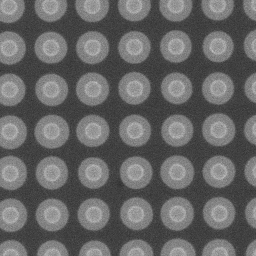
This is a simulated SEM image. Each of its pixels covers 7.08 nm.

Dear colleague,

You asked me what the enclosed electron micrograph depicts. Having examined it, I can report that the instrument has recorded an array of small figures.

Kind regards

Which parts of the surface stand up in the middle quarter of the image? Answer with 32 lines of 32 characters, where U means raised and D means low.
DDDDDDDDDDDDDDDDDDDDDDDDDDDDDDDD
DDDDDDDDDDDDDDDDDDDDDDDDDDDDDDDD
DDDDDDUUUDDDDDDDUUUDDDDDDDDUUUDD
DDDDUUUUUUDDDDDUUUUUUDDDDUUUUUUD
DDDUUUUUUUUDDDUUUUUUUDDDDUUUUUUU
UDDUUUUUUUUDDDUUUUUUUDDDUUUUUUUU
UDDUUUUUUUUDDDUUUUUUUDDDUUUUUUUU
UDDUUUUUUUUDDDUUUUUUUDDDDUUUUUUU
DDDDUUUUUUUDDDUUUUUUUDDDDUUUUUUD
DDDDDUUUUUDDDDDUUUUUDDDDDDDUUUDD
DDDDDDDDDDDDDDDDDDDDDDDDDDDDDDDD
DDDDDDDDDDDDDDDDDDDDDDDDDDDDDDDD
DDDDDDDDDDDDDDDDDDDDDDDDDDDDDDDD
DDDDDUUUUUDDDDDUUUUUDDDDDDUUUUUD
UDDDUUUUUUUDDDDUUUUUUDDDDUUUUUUU
UDDUUUUUUUUDDDUUUUUUUUDDUUUUUUUU
UDDUUUUUUUUDDDUUUUUUUUDDUUUUUUUU
UDDUUUUUUUUDDDUUUUUUUUDDDUUUUUUU
UDDUUUUUUUUDDDUUUUUUUDDDDUUUUUUU
DDDDUUUUUUDDDDDUUUUUUDDDDUUUUUUD
DDDDDDUUDDDDDDDDDDDDDDDDDDDDDDDD
DDDDDDDDDDDDDDDDDDDDDDDDDDDDDDDD
DDDDDDDDDDDDDDDDDDDDDDDDDDDDDDDD
DDDDDDUUDDDDDDDDUUUUDDDDDDUUUUDD
DDDDDUUUUUDDDDDUUUUUUDDDDUUUUUUU
UDDDUUUUUUUDDDUUUUUUUUDDUUUUUUUU
UDDDUUUUUUUDDDUUUUUUUUDDUUUUUUUU
UDDDUUUUUUUDDDUUUUUUUUDDUUUUUUUU
UDDDUUUUUUUDDDUUUUUUUUDDUUUUUUUU
DDDDUUUUUUDDDDDUUUUUUDDDDUUUUUUU
DDDDDUUUUUDDDDDDUUUUDDDDDDUUUUUD
DDDDDDDDDDDDDDDDDDDDDDDDDDDDDDDD